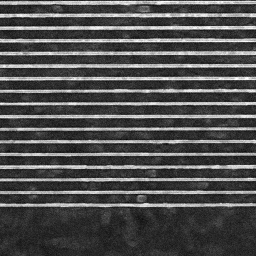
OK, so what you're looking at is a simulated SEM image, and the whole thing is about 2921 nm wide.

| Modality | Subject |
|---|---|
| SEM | parallel lines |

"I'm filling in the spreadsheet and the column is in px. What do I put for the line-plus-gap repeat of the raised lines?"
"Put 12.6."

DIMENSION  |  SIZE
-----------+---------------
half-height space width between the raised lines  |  116 nm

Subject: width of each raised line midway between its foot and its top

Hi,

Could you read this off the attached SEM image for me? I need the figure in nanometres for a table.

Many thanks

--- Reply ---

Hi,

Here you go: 28.5